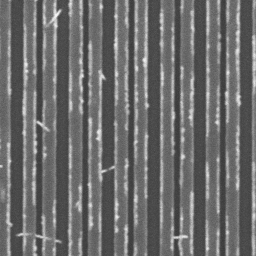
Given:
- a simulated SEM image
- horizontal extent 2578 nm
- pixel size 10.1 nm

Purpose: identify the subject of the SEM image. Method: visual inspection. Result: parallel lines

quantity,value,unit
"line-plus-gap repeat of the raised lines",227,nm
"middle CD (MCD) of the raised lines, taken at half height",0.133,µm